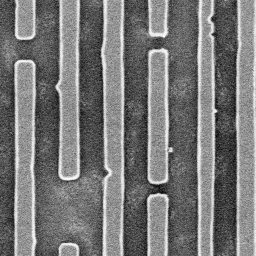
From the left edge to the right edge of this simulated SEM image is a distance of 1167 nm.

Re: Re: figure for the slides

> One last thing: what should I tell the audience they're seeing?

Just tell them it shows parallel lines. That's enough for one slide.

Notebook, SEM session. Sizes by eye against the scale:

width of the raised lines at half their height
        80.3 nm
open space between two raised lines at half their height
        122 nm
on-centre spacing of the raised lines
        44.7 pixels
